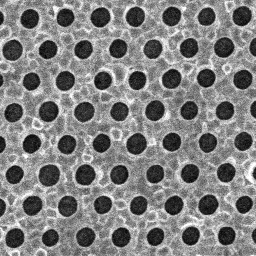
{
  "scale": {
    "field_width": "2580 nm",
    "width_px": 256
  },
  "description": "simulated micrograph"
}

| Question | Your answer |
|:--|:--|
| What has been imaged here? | a regular array of holes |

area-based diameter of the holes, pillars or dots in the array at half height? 0.197 um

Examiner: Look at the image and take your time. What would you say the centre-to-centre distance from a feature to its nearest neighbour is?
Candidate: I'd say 352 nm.